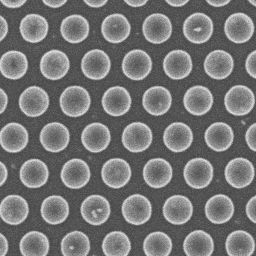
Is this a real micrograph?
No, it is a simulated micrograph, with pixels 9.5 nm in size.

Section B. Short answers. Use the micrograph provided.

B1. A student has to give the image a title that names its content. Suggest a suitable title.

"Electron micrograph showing a regular array of raised bodies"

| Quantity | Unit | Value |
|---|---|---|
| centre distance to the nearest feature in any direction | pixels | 41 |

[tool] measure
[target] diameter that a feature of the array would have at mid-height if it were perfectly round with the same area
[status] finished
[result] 267 nanometers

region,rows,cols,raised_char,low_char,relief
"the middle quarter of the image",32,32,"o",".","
o...ooooooo....ooooooo...ooooooo
o....oooooo....ooooooo...ooooooo
.....oooooo....oooooo.....ooooo.
........o........oo........oo...
................................
................................
.oooo......oooo......ooooo.....o
oooooo....oooooo....oooooo.....o
oooooo....oooooo....ooooooo...oo
oooooo....oooooo....ooooooo...oo
oooooo....oooooo....oooooo....oo
oooooo....oooooo.....ooooo.....o
.oooo.......ooo.......ooo.......
................................
................................
......oooo......oooo......oooo..
o....oooooo....oooooo.....oooooo
o....oooooo....ooooooo...ooooooo
o....oooooo....ooooooo...ooooooo
o....oooooo....ooooooo...ooooooo
o....oooooo....oooooo.....ooooo.
......ooo.......ooo........ooo..
................................
................................
.oooo......oooo......ooooo.....o
oooooo....oooooo....oooooo.....o
oooooo....oooooo....ooooooo...oo
oooooo....oooooo....ooooooo...oo
oooooo....oooooo....ooooooo...oo
oooooo....oooooo.....ooooo.....o
.oooo.......ooo.......ooo.......
................................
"